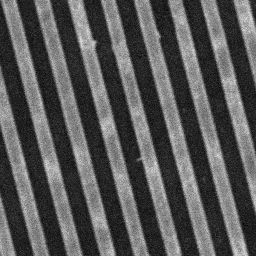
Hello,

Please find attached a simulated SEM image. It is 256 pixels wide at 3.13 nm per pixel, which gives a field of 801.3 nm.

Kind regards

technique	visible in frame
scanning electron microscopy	parallel lines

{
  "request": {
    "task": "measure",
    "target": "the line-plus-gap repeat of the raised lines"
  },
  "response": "100 nanometres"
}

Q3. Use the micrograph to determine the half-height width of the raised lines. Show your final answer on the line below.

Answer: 45.4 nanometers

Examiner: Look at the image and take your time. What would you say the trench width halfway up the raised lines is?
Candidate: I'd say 56.8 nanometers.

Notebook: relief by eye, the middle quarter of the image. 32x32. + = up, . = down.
+....++++.....+++.....+++.....++
+.....+++.....+++.....++++....++
+.....+++.....++++....++++.....+
+.....++++....++++.....+++.....+
++....++++.....+++.....++++....+
++.....+++.....+++.....++++.....
++.....+++.....++++....++++.....
++.....++++....++++.....+++.....
+++....++++.....+++.....++++....
+++.....+++.....+++.....++++....
+++.....+++.....++++....++++....
+++.....++++....++++.....+++....
++++....++++.....+++.....++++...
++++.....+++.....+++.....++++...
++++.....+++.....++++....++++...
.+++.....++++....++++.....+++...
.++++....++++.....+++.....++++..
.++++.....+++.....+++.....++++..
.++++.....+++.....++++....++++..
..+++.....++++....++++.....+++..
..++++....++++.....+++.....++++.
..++++.....+++.....+++.....++++.
...+++.....+++.....++++....++++.
...+++.....++++....++++.....+++.
...++++.....+++.....+++.....++++
...++++.....+++.....+++.....++++
....+++.....++++....++++.....+++
....++++....++++.....+++.....+++
....++++.....+++.....+++.....+++
....++++.....+++.....++++....+++
.....+++.....++++....++++.....++
.....++++....++++.....+++.....++